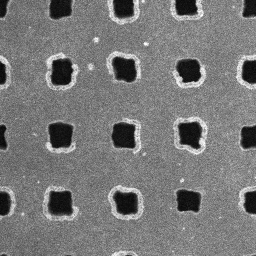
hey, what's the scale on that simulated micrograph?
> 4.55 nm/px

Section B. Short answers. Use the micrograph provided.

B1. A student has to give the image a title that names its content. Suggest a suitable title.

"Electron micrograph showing a regular array of holes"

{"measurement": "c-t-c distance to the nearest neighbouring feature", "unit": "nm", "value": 287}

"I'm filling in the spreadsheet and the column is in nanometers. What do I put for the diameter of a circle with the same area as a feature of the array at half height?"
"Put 114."